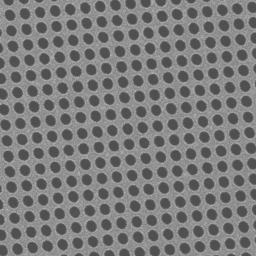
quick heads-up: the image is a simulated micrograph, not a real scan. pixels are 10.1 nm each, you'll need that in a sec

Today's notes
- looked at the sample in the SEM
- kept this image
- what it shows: a regular array of holes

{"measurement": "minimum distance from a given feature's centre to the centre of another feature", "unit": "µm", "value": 0.151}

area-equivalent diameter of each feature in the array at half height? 112 nanometers